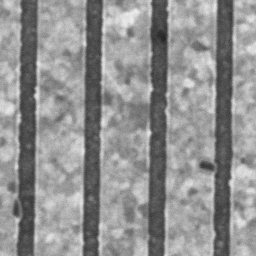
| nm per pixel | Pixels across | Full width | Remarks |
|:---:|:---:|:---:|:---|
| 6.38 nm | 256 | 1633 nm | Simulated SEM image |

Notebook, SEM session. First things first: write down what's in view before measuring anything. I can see one or a few lines or trenches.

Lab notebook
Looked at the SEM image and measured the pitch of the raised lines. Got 417 nm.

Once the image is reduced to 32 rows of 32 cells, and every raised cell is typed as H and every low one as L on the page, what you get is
HHLLLHHHHHHLLHHHHHHLLHHHHHHLLHHH
HHLLLHHHHHHLLHHHHHHLLHHHHHHLLHHH
HHLLLHHHHHHLLHHHHHHLLHHHHHHLLHHH
HHHLLHHHHHHLLHHHHHHLLHHHHHHLLHHH
HHLLLHHHHHHLLHHHHHHLLHHHHHHLLHHH
HHLLLHHHHHHLLHHHHHHLLHHHHHHLLHHH
HHLLLHHHHHHLLHHHHHHLLHHHHHHLLHHH
HHLLLHHHHHHLLHHHHHHLLHHHHHHLLHHH
HHLLLHHHHHHLLHHHHHHLLHHHHHHLLHHH
HHLLLHHHHHLLLHHHHHHLLHHHHHHLLHHH
HHLLLHHHHHLLLHHHHHHLLHHHHHHLLHHH
HHLLHHHHHHLLLHHHHHHLLHHHHHHLLHHH
HHLLHHHHHHLLLHHHHHHLLHHHHHHLLHHH
HHLLLHHHHHLLLHHHHHHLLHHHHHHLLHHH
HHHLLHHHHHLLLHHHHHHLLHHHHHHLLHHH
HHLLLHHHHHLLLHHHHHHLLHHHHHHLLHHH
HHLLLHHHHHLLLHHHHHHLLHHHHHHLLHHH
HHLLLHHHHHLLLHHHHHHLLHHHHHHLLHHH
HHLLLHHHHHHLLHHHHHHLLHHHHHHLLHHH
HHLLLHHHHHLLLHHHHHHLLHHHHHHLLHHH
HHLLLHHHHHLLLHHHHHHLLHHHHHHLLHHH
HHLLLHHHHHLLLHHHHHLLLHHHHHHLLHHH
HHLLLHHHHHLLLHHHHHLLLHHHHHHLLHHH
HHLLLHHHHHLLLHHHHHLLLHHHHHHLLHHH
HHLLLHHHHHLLLHHHHHLLLHHHHHHLLHHH
HHHLHHHHHHLLLHHHHHLLLHHHHHHLLHHH
HHHLLHHHHHLLLHHHHHLLLHHHHHHLLHHH
HHLLLHHHHHLLLHHHHHLLLHHHHHLLLHHH
HHLLHHHHHHLLHHHHHHLLLHHHHHHLLHHH
HHLLHHHHHHLLHHHHHHHLLHHHHHHLLHHH
HHLLHHHHHHLLHHHHHHLLLHHHHHHLLHHH
HHLLLHHHHHLLHHHHHHLLLHHHHHHLLHHH